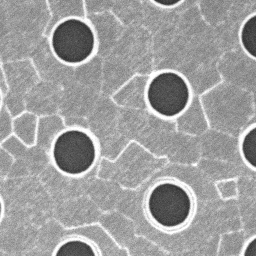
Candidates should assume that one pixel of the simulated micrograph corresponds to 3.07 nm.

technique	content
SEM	holes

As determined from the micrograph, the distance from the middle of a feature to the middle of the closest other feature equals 335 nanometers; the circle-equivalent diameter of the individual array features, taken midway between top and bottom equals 138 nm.